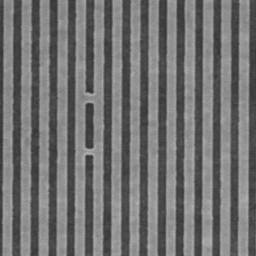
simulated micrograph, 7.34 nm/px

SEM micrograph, parallel lines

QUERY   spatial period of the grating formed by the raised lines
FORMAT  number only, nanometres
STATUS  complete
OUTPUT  133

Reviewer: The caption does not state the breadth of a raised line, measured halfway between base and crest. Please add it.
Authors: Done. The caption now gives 66.1 nm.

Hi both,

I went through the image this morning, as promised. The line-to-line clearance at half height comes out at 66.1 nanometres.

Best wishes